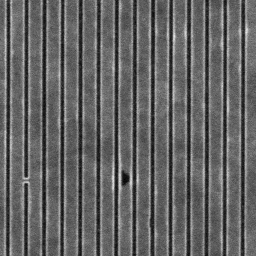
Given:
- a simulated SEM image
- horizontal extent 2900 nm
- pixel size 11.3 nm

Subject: parallel lines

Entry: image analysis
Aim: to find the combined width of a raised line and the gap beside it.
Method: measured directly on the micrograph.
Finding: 205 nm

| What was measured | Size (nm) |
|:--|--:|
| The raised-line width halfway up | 153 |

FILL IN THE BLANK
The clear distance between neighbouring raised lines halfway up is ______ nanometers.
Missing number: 53.8